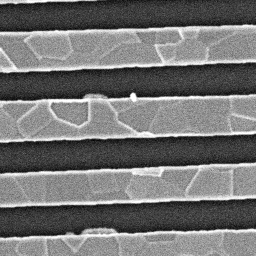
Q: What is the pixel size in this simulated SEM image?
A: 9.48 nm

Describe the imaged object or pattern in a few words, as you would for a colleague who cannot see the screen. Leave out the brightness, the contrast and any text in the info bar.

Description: lines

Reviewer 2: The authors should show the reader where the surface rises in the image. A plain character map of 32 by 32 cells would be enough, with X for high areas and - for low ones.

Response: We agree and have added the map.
--------------------------------
--------------------------------
--------------------------------
--------------------XXXXXXXXXXXX
XXXXXXXXXXXXXXXXXXXXXXXXXXXXXXXX
XXXXXXXXXXXXXXXXXXXXXXXXXXXXXXXX
XXXXXXXXXXXXXXXXXXXXXXXXXXXXXXXX
XXXXXXXXXXXXXXXXXXXXXXXXXXXXXXXX
XXXXXXXXXXXXXXX-----------------
--------------------------------
--------------------------------
--------------------------------
-----XXXXXXXXXXXXXXXXXXXXXXXXXXX
XXXXXXXXXXXXXXXXXXXXXXXXXXXXXXXX
XXXXXXXXXXXXXXXXXXXXXXXXXXXXXXXX
XXXXXXXXXXXXXXXXXXXXXXXXXXXXXXXX
XXXXXXXXXXXXXXXXXXXXXXXXXXXXXXXX
XXXXXXX-------------------------
--------------------------------
--------------------------------
------------------------------XX
-----XXXXXXXXXXXXXXXXXXXXXXXXXXX
XXXXXXXXXXXXXXXXXXXXXXXXXXXXXXXX
XXXXXXXXXXXXXXXXXXXXXXXXXXXXXXXX
XXXXXXXXXXXXXXXXXXXXXXXXXXXXXXXX
XXXXXXXXXXXX--------------------
--------------------------------
--------------------------------
--------------------------------
-------XXXXXXXXXXXXXXXXXXXXXXXXX
XXXXXXXXXXXXXXXXXXXXXXXXXXXXXXXX
XXXXXXXXXXXXXXXXXXXXXXXXXXXXXXXX